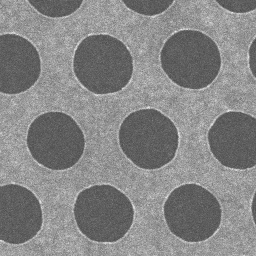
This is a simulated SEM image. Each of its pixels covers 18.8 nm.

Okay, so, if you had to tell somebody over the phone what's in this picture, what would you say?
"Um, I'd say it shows holes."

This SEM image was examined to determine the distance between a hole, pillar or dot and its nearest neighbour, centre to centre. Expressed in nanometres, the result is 1630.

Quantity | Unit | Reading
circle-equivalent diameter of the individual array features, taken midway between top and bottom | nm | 1120